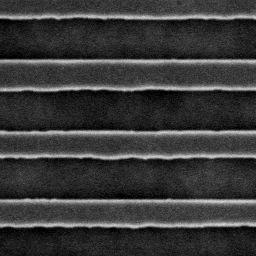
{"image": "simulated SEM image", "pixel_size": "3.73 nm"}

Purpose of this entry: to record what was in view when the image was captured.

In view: lines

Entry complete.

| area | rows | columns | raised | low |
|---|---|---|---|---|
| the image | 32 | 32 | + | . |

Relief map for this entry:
++++++++++++++++++++++++++++++++
++++++++++++++++++++++++++++++++
................................
................................
................................
................................
................................
................................
++++++++++++++++++++++++++++++++
++++++++++++++++++++++++++++++++
++++++++++++++++++++++++++++++++
................................
................................
................................
................................
................................
......++.+.+++......++.+++.+++.+
++++++++++++++++++++++++++++++++
++++++++++++++++++++++++++++++++
++++++++++++++++++++++++++++++++
................................
................................
................................
................................
................................
++++++++++++++++++++++++++++++++
++++++++++++++++++++++++++++++++
++++++++++++++++++++++++++++++++
................................
................................
................................
................................